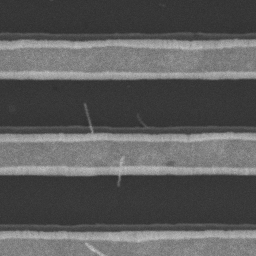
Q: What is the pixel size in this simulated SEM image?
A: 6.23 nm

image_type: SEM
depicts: lines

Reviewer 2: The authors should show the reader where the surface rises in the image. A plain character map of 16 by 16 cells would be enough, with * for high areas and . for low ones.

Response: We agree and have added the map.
................
................
****************
****************
****************
................
................
................
****************
****************
****************
................
................
................
****************
****************